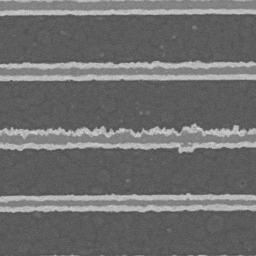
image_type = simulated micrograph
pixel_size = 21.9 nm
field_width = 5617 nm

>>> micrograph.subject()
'one or a few lines or trenches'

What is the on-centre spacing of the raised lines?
1.44 micrometres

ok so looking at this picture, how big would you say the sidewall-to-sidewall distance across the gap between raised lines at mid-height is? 1140 nanometers